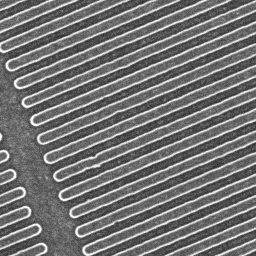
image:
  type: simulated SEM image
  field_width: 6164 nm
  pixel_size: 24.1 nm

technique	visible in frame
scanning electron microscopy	parallel lines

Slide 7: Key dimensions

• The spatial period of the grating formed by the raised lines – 482 nanometers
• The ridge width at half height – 236 nanometres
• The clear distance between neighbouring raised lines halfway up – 236 nm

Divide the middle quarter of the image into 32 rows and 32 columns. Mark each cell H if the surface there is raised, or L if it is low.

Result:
HHHLLLLLLHHHHHHHLLLLLLHHHHHHHLLL
LLLLLLLHHHHHHLLLLLLLHHHHHHLLLLLL
LLLLLHHHHHHLLLLLLHHHHHHLLLLLLLHH
LLHHHHHHLLLLLLLHHHHHHLLLLLLLHHHH
HHHHHHLLLLLLHHHHHHHLLLLLLHHHHHHH
HHHHLLLLLLHHHHHHLLLLLLLHHHHHHLLL
HLLLLLLLHHHHHHLLLLLLLHHHHHHLLLLL
LLLLLHHHHHHHLLLLLLHHHHHHHLLLLLLH
LLLHHHHHHHLLLLLLHHHHHHLLLLLLLHHH
LHHHHHHLLLLLLHHHHHHHLLLLLLHHHHHH
HHHHHLLLLLLHHHHHHHLLLLLLHHHHHHHL
HHLLLLLLLHHHHHHLLLLLLLHHHHHHLLLL
LLLLLLHHHHHHLLLLLLLHHHHHHLLLLLLL
LLLLHHHHHHHLLLLLLHHHHHHHLLLLLLHH
LLHHHHHHLLLLLLLHHHHHHLLLLLLLHHHH
HHHHHHLLLLLLHHHHHHLLLLLLLHHHHHHH
HHHLLLLLLLHHHHHHLLLLLLLHHHHHHLLL
HLLLLLLLHHHHHHLLLLLLHHHHHHHLLLLL
LLLLLHHHHHHHLLLLLLHHHHHHLLLLLLLH
LLLHHHHHHLLLLLLLHHHHHHLLLLLLLHHH
HHHHHHHLLLLLLLHHHHHHLLLLLLHHHHHH
HHHHLLLLLLLHHHHHHLLLLLLLHHHHHHLL
HHLLLLLLLHHHHHHLLLLLLLHHHHHHLLLL
LLLLLLLHHHHHHLLLLLLHHHHHHLLLLLLL
LLLLHHHHHHLLLLLLLHHHHHHLLLLLLHHH
LHHHHHHHHLLLLLHHHHHHHLLLLLLHHHHH
HHHHHLLLLLLLHHHHHHLLLLLLLHHHHHHL
HHHLLLLLLLHHHHHHLLLLLLHHHHHHHLLL
LLLLLLLHHHHHHLLLLLLLHHHHHHLLLLLL
LLLLLHHHHHHLLLLLLLHHHHHHLLLLLLLH
LLLHHHHHHLLLLLLHHHHHHHLLLLLLHHHH
HHHHHHLLLLLLLHHHHHHLLLLLLLHHHHHH